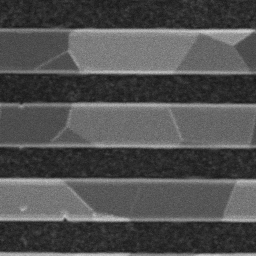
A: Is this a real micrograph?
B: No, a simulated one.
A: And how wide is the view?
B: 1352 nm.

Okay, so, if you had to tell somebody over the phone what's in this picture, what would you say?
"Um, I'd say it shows one or a few lines or trenches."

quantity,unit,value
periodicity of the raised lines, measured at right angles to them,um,0.392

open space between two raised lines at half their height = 179 nm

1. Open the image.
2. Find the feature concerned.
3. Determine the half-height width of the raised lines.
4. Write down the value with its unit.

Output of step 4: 219 nanometers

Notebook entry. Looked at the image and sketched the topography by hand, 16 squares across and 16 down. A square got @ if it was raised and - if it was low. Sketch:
----------------
----------------
@@@@@@@@@@@@@@@@
@@@@@@@@@@@@@@@@
----@@@@@@@@@@@@
----------------
----------------
@@@@@@@@@@@@@@@@
@@@@@@@@@@@@@@@@
----------------
----------------
@@@@@@@@@@@@@@@@
@@@@@@@@@@@@@@@@
@@@@@@@@@@@@@@@@
----------------
----------------